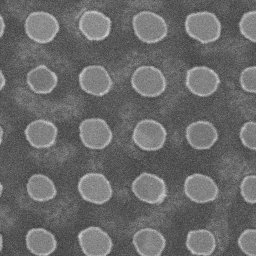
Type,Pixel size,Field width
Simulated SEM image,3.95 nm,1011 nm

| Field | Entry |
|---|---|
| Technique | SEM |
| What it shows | a regular array of raised bodies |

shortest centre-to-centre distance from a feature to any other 210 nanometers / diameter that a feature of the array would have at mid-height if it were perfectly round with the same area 119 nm